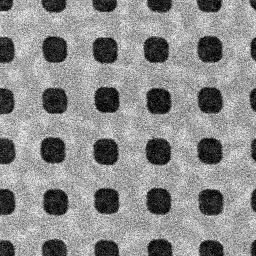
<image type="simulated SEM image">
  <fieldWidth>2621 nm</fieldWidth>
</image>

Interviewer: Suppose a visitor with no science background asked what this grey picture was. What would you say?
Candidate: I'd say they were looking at a regular array of holes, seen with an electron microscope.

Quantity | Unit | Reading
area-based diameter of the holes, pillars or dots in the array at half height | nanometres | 283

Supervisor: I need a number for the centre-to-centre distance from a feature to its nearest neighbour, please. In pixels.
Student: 50.1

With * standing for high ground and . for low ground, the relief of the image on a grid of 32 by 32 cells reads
..***...****...***...****...***.
.*****..*****.*****..****..*****
********************************
********************************
******.*************************
..***...****...***...****...***.
..***...****...***...****...***.
..****..****..****...****..*****
********************************
********************************
********************************
.****...****...***...****...***.
..***...****...***...****...***.
..***...****...***...****...***.
********************************
********************************
********************************
.****...****..*****..****..*****
..***...****...***...****...***.
..***...****...***...****...***.
.*****.*****..*****..*****.*****
********************************
********************************
*************.*****.************
..***...****...***...****...***.
..***....***...***...****...***.
..****..****...****..****...****
********************************
********************************
********************************
..***...****...****..****...***.
..***...****...***....***...***.